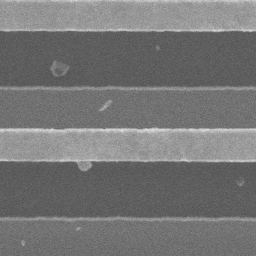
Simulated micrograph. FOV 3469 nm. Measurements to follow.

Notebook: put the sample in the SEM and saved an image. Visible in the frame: lines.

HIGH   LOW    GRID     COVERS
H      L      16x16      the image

HHHHHHHHHHHHHHHH
HHHHHHHHHHHHHHHH
LLLLLLLLLLLLLLLL
LLLLLLLLLLLLLLLL
LLLLLLLLLLLLLLLL
LLLLLLLLLLLLLLLL
HHHHHHHHHHHHHHHH
HHHHHHHHHHHHHHHH
HHHHHHHHHHHHHHHH
HHHHHHHHHHHHHHHH
LLLLLLLLLLLLLLLL
LLLLLLLLLLLLLLLL
LLLLLLLLLLLLLLLL
LLLLLLLLLLLLLLLL
HHHHHHHHHHHHHHHH
HHHHHHHHHHHHHHHH